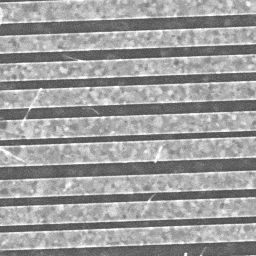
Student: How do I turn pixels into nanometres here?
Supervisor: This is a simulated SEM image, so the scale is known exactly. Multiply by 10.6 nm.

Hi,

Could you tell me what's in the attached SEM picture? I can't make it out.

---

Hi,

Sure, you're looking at parallel lines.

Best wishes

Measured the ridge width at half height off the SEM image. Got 192 nm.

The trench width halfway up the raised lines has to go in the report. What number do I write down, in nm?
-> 104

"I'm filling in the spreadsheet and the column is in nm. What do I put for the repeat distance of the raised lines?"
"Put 300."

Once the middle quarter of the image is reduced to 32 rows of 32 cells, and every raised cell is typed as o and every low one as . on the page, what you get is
oooooooooooooooooooooooooooooooo
oooooooooooooooooooooooooooooooo
ooooooooooooooooooooooooooooo...
oo..............................
................................
..............o.....oooooooooooo
oooooooooooooooooooooooooooooooo
oooooooooooooooooooooooooooooooo
oooooooooooooooooooooooooooooooo
oooooooooooooooooooooooooooo....
o...............................
................................
...............................o
....oooooooooooooooooooooooooooo
oooooooooooooooooooooooooooooooo
oooooooooooooooooooooooooooooooo
oooooooooooooooooooooooooooooooo
ooooooooooooooooooooo...........
................................
..................oooooooooooooo
oooooooooooooooooooooooooooooooo
oooooooooooooooooooooooooooooooo
oooooooooooooooooooooooooooooooo
oooooooooooooooooooooooooooooooo
oooooooooooo..oo................
................................
................................
...............................o
....oooooooooooooooooooooooooooo
oooooooooooooooooooooooooooooooo
oooooooooooooooooooooooooooooooo
oooooooooooooooooooooooooooooooo